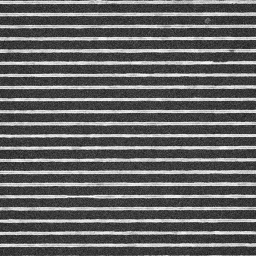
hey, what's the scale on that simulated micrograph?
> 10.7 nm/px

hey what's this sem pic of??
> parallel lines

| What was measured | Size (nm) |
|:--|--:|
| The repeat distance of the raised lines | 130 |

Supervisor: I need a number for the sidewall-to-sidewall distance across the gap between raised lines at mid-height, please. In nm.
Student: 100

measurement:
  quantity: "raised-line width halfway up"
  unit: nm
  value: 28